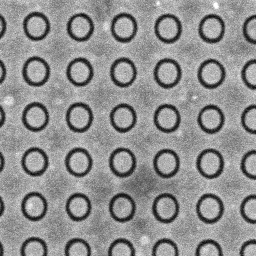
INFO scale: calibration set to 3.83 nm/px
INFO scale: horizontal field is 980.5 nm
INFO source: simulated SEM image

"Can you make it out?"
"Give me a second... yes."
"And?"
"a regular array of ring-shaped grooves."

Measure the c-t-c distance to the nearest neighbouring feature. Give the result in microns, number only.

0.167